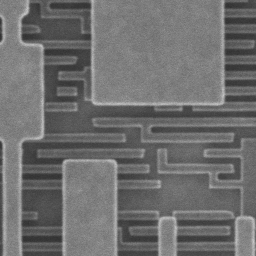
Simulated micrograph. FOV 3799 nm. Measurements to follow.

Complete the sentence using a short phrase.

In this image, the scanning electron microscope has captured wiring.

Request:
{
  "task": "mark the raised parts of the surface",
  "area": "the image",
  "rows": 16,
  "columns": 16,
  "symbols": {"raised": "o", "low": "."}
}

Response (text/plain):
oo....oooooooo..
o.....oooooooo..
oo....oooooooo..
ooo...oooooooo..
ooo...oooooooo..
ooo...oooooooo..
ooo...oooooooo..
ooo.............
oo..............
o...............
o...ooo.........
o...ooo.........
o...ooo.........
o...ooo.........
o...ooo...o....o
o...ooo...o....o